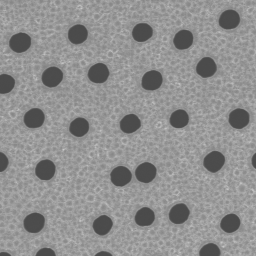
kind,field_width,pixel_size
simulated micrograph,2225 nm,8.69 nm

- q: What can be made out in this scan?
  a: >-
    a regular array of holes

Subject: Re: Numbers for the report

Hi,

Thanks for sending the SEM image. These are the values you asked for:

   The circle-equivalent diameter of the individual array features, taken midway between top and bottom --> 175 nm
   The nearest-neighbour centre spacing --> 0.394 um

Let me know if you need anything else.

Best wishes